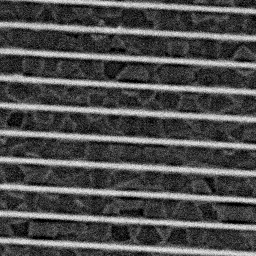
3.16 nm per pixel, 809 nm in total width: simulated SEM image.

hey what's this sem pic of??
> parallel lines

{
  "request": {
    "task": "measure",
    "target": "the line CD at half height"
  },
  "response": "0.017 microns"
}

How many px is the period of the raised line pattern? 27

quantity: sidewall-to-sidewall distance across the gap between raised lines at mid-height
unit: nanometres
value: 69.1